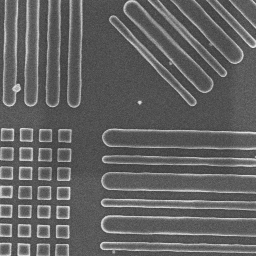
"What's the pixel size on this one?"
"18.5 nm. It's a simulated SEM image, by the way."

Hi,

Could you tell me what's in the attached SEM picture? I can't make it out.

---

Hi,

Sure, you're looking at groups of lines, slits or small figures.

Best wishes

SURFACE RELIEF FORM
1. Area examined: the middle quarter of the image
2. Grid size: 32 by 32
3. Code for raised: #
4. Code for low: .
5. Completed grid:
.###..................###...####
.###...................###...###
.###....................###...##
.###.....................###...#
.###......................###...
.###.......................##...
.###........................##..
.###.........................##.
.###..........................##
.###...........................#
..#.............................
................................
................................
................................
................................
................................
...........###..................
##........######################
##........######################
##........######################
...........#####################
##..............................
##..............................
##........######################
..........######################
................................
#...............................
#.........##############........
#.........######################
..........######################
..........######################
#....................###########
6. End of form